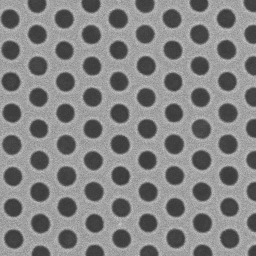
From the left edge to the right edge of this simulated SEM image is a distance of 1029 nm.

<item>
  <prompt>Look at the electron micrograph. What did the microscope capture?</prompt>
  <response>a regular array of holes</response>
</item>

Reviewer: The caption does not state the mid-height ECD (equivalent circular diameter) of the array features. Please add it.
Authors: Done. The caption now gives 0.0754 microns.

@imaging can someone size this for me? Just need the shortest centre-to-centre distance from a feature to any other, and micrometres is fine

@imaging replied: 0.124